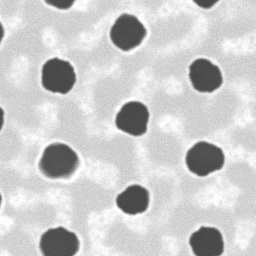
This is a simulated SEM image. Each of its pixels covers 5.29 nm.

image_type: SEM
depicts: holes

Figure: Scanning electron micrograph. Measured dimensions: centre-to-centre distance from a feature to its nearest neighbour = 435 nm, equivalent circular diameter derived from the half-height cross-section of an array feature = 0.187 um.